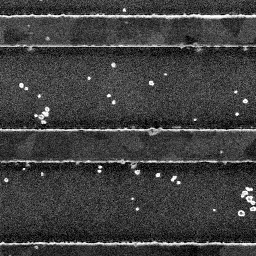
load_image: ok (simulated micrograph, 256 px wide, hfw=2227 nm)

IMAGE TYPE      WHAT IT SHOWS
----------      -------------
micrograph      lines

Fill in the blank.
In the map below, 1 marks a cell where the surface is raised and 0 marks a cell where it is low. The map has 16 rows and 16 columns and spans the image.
0000000000000000
1111111111111111
1111111111111111
0000000000000000
0000000000000000
0000000000000000
0000000000000000
0000000000000000
1111111111111111
1111111111111111
0000000000000000
0000000000000000
0000000000000000
0000000000000000
0000000000000000
1111111111111111